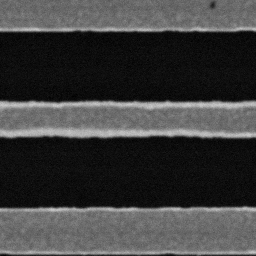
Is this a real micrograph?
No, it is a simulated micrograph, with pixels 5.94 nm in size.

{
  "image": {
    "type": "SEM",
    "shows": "lines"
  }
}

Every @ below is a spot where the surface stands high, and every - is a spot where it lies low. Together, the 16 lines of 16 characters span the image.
@@@@@@@@@@@@@@@@
@@@@@@@@@@@@@@@@
----------------
----------------
----------------
----------------
@@@@@@@@@@@@@@@@
@@@@@@@@@@@@@@@@
@@--@@@@@---@@@@
----------------
----------------
----------------
----------------
@@@@@@@@@@@@@@@@
@@@@@@@@@@@@@@@@
@@@@@@@@@@@@@@@@